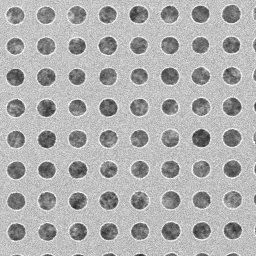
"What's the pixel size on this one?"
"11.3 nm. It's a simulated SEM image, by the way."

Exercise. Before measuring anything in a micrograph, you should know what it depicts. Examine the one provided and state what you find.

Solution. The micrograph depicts a regular array of holes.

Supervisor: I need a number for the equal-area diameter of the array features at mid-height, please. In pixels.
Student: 18.8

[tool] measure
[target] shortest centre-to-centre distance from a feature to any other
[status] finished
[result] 349 nm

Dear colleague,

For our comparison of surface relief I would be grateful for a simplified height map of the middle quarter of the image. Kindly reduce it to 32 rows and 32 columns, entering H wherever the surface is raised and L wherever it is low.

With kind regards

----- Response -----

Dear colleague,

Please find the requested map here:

HHHHHHHHHHHHHHHHHHHHHHHHHHHHHHHH
HHLLLHHHHLLLLHHHHLLLHHHHHLLLHHHH
HLLLLHHHHLLLLHHHHLLLLHHHLLLLLHHH
HLLLLHHHHLLLLHHHLLLLLHHHLLLLLHHH
HHLLLHHHHLLLLHHHHLLLLHHHHLLLHHHH
HHHHHHHHHHHLHHHHHHHHHHHHHHHHHHHH
HHHHHHHHHHHHHHHHHHHHHHHHHHHHHHHH
HHHHHHHHHHHHHHHHHHHHHHHHHHHHHHHH
HHHHHHHHHHHHHHHHHHHHHHHHHHHHHHHH
HHLLLHHHHLLLLHHHHLLLLHHHHLLLHHHH
HLLLLLHHHLLLLHHHLLLLLHHHLLLLLHHH
HLLLLLHHHLLLLHHHLLLLLHHHLLLLLHHH
HHLLLHHHHLLLLHHHHLLLHHHHHLLLHHHH
HHHHHHHHHHHHHHHHHHHHHHHHHHHHHHHH
HHHHHHHHHHHHHHHHHHHHHHHHHHHHHHHH
HHHHHHHHHHHHHHHHHHHHHHHHHHHHHHHH
HHHLHHHHHHLLHHHHHHLLHHHHHHLLHHHH
HLLLLHHHHLLLLHHHHLLLLHHHLLLLLHHH
HLLLLLHHHLLLLLHHLLLLLHHHLLLLLHHH
HLLLLLHHHLLLLHHHHLLLLHHHLLLLLHHH
HHLLLHHHHHLLLHHHHLLLHHHHHLLLHHHH
HHHHHHHHHHHHHHHHHHHHHHHHHHHHHHHH
HHHHHHHHHHHHHHHHHHHHHHHHHHHHHHHH
HHHHHHHHHHHHHHHHHHHHHHHHHHHHHHHH
HHLLLHHHHHLLHHHHHHLLHHHHHLLLHHHH
HLLLLLHHHLLLLHHHHLLLLHHHLLLLLHHH
HLLLLLHHHLLLLLHHLLLLLHHHLLLLLHHH
HLLLLLHHHLLLLHHHHLLLLHHHLLLLLHHH
HHLLLHHHHHLLHHHHHHLLHHHHHHLHHHHH
HHHHHHHHHHHHHHHHHHHHHHHHHHHHHHHH
HHHHHHHHHHHHHHHHHHHHHHHHHHHHHHHH
HHHHHHHHHHHHHHHHHHHHHHHHHHHHHHHH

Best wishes